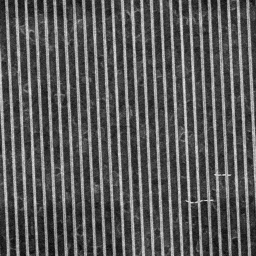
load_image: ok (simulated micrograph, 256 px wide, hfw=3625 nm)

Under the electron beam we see parallel lines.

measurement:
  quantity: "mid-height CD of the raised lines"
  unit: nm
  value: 23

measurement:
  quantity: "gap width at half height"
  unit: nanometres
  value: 111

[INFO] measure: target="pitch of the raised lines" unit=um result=0.136